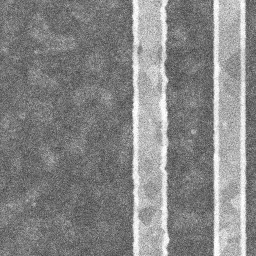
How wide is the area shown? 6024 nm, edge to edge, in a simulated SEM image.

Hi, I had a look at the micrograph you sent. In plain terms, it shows one or a few lines or trenches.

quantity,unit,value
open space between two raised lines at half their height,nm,1230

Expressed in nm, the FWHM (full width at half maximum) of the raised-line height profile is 635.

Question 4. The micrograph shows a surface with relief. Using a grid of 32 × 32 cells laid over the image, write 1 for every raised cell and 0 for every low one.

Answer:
00000000000000000111100000011100
00000000000000000111000000011100
00000000000000000111000000011100
00000000000000000111100000011100
00000000000000000111100000011100
00000000000000000111000000011100
00000000000000000111000000011100
00000000000000000111000000011100
00000000000000000111000000011100
00000000000000000111000000011100
00000000000000000111000000011100
00000000000000000111000000011100
00000000000000000111000000011100
00000000000000000111000000011100
00000000000000000111100000011100
00000000000000000111100000011100
00000000000000000111000000011100
00000000000000000111100000011100
00000000000000000111100000011100
00000000000000000111000000011100
00000000000000000111000000011100
00000000000000000111100000011100
00000000000000000111000000011100
00000000000000000111100000011100
00000000000000000111000000011100
00000000000000000111100000011100
00000000000000000111100000011100
00000000000000000111000000011100
00000000000000000111100000011100
00000000000000000111100000011100
00000000000000000111100000011100
00000000000000000111100000011100